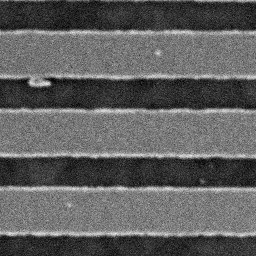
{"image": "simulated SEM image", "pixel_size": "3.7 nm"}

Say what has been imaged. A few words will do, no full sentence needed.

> lines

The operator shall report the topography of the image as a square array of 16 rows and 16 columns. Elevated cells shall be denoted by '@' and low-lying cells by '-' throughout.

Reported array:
----------------
----------------
@@@@@@@@@@@@@@@@
@@@@@@@@@@@@@@@@
@@@@@@@@@@@@@@@@
----------------
----------------
@@@@@@@@@@@@@@@@
@@@@@@@@@@@@@@@@
@@@@@@@@@@@@@@@@
----------------
----------------
@@@@@@@@@@@@@@@@
@@@@@@@@@@@@@@@@
@@@@@@@@@@@@@@@@
----------------